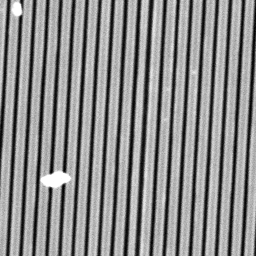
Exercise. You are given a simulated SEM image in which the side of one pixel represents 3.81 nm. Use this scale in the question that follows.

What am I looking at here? parallel lines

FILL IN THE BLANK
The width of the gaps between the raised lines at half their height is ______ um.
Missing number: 0.0147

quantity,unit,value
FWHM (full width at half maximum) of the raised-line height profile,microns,0.0333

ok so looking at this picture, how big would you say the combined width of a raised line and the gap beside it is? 49.6 nm